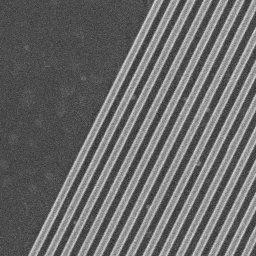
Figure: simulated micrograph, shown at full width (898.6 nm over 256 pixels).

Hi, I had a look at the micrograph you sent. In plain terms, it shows parallel lines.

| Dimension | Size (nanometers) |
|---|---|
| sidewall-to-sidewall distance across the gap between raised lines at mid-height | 27.1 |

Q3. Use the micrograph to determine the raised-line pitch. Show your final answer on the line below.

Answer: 0.0513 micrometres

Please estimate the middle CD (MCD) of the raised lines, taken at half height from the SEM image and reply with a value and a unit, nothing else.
24 nm